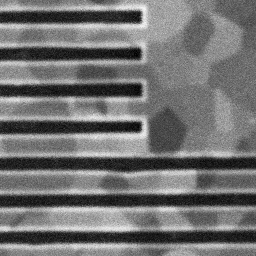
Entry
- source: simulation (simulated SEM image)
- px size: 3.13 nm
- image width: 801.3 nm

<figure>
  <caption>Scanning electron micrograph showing parallel lines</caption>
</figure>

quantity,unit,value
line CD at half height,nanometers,65.7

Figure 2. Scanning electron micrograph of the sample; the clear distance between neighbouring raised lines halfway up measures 49.3 nm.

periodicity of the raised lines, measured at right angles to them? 115 nm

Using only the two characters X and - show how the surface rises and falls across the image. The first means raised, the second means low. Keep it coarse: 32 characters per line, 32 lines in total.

XXXXXXXXXXXXXXXXXXXXXXXXXXXXXXXX
------------------XXXXXXXXXXXXXX
------------------XXXXXXXXXXXXXX
XXXXXXXXXXXXXXXXXXXXXXXXXXXXXXXX
XXXXXXXXXXXXXXXXXXXXXXXXXXXXXXXX
XXXXXXXXXXXXXXXXXXXXXXXXXXXXXXXX
------------------XXXXXXXXXXXXXX
------------------XXXXXXXXXXXXXX
XXXXXXXXXXXXXXXXXXXXXXXXXXXXXXXX
XXXXXXXXXXXXXXXXXXXXXXXXXXXXXXXX
------------------XXXXXXXXXXXXXX
------------------XXXXXXXXXXXXXX
XXXXXXXXXXXXXXXXXXXXXXXXXXXXXXXX
XXXXXXXXXXXXXXXXXXXXXXXXXXXXXXXX
XXXXXXXXXXXXXXXXXXXXXXXXXXXXXXXX
------------------XXXXXXXXXXXXXX
------------------XXXXXXXXXXXXXX
XXXXXXXXXXXXXXXXXXXXXXXXXXXXXXXX
XXXXXXXXXXXXXXXXXXXXXXXXXXXXXXXX
X------------------XXXXX-XX-----
--------------------------------
----XX----------------XXXXXXXXXX
XXXXXXXXXXXXXXXXXXXXXXXXXXXXXXXX
XXXXXXXXXXXXXXXXXXXXXXXXXXXXXXXX
--------------------------------
--------------------------------
XXXXXXXXXXXXXXXXXXXXXXXXXXXXXXXX
XXXXXXXXXXXXXXXXXXXXXXXXXXXXXXXX
XXXXXXXXXXXXXXXXXXXXXXXXXXXXXXXX
--------------------------------
--------------------------------
XXXXXXXXXXXXXXXXXXXXXXXXXXXXXXXX